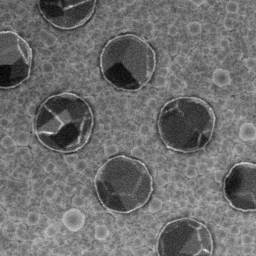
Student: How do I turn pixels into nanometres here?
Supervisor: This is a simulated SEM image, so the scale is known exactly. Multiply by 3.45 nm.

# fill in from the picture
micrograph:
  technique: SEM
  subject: raised bodies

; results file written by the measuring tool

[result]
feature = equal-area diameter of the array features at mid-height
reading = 194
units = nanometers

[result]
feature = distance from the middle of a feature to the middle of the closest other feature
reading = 294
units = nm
